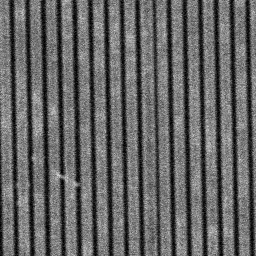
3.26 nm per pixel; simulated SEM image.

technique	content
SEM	parallel lines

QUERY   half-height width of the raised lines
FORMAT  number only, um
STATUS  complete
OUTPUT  0.0313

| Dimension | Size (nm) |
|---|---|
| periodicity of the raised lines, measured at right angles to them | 51.2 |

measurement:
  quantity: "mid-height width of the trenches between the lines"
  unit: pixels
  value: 6.1